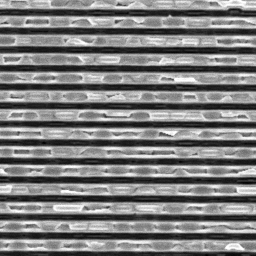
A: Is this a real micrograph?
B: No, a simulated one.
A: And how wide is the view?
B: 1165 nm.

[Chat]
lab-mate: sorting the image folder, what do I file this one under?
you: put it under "parallel lines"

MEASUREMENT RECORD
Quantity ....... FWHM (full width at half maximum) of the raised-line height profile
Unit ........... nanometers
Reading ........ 50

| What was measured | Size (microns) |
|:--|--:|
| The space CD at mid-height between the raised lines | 0.0335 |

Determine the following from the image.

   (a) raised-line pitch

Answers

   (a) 0.0846 um